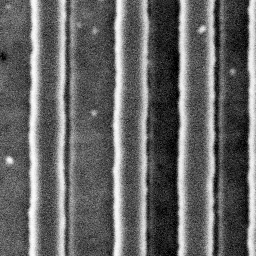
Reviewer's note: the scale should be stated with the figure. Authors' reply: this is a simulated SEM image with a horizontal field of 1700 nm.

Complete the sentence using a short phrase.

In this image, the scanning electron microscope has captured lines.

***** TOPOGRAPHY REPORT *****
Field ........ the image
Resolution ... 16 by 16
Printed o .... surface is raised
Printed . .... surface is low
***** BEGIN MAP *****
..oo...oo..oo...
..oo...oo..oo...
..oo...oo..oo...
..oo...oo..oo...
..oo...oo..oo...
..oo...oo..oo...
..oo...oo..oo...
..oo...oo..oo...
..oo...oo..oo...
..oo...oo..oo...
..oo...oo..oo...
..oo...oo..oo...
..oo...oo..oo...
..oo...oo..oo...
..oo...oo..oo...
..oo...oo..oo...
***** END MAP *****